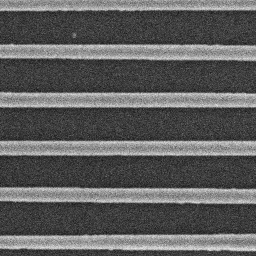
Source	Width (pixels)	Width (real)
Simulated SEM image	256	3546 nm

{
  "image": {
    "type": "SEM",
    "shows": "lines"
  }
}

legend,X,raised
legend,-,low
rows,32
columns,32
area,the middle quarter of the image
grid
--------------------------------
--------------------------------
--------------------------------
--------------------------------
--------------------------------
--------------------------------
--------------------------------
XXXXXXXXXXXXXXXXXXXXXXXXXXXXXXXX
XXXXXXXXXXXXXXXXXXXXXXXXXXXXXXXX
XXXXXXXXXXXXXXXXXXXXXXXXXXXXXXXX
XXXXXXXXXXXXXXXXXXXXXXXXXXXXXXXX
--------------------------------
--------------------------------
--------------------------------
--------------------------------
--------------------------------
--------------------------------
--------------------------------
--------------------------------
XXXXXXXXXXXXXXXXXXXXXXXXXXXXXXXX
XXXXXXXXXXXXXXXXXXXXXXXXXXXXXXXX
XXXXXXXXXXXXXXXXXXXXXXXXXXXXXXXX
XXXXXXXXXXXXXXXXXXXXXXXXXXXXXXXX
--------------------------------
--------------------------------
--------------------------------
--------------------------------
--------------------------------
--------------------------------
--------------------------------
--------------------------------
XXXXXXXXXXXXXXXXXXXXXXXXXXXXXXXX